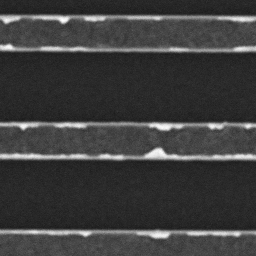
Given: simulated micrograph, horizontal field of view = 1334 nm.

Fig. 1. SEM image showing one or a few lines or trenches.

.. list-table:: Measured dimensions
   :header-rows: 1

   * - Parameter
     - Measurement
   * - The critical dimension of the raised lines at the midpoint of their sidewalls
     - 183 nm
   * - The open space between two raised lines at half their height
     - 377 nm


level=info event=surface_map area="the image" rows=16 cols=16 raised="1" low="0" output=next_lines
0000000000000000
1111111111111111
1111111111111111
0000000000000000
0000000000000000
0000000000000000
0000000000000000
0000000000000000
1111111111111111
1111111111111111
0000000000000000
0000000000000000
0000000000000000
0000000000000000
1111111111111111
1111111111111111